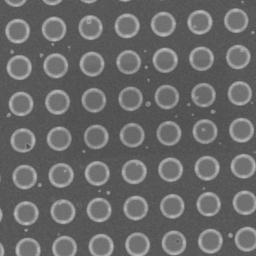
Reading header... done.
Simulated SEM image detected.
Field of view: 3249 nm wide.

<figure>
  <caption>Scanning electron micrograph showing an array of small figures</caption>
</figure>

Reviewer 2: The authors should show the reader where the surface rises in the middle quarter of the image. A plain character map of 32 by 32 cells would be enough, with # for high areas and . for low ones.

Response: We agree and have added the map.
#...######...######....#####....
#...######....####.....####.....
.....####......#................
................................
................................
........................###.....
......###......####....#####....
#....#####....#####....######...
#....#####....######...######...
#...######....######...#####....
#....#####....#####.....####....
#.....###......###..............
................................
................................
.........................##.....
.......###.....####.....#####...
#.....#####...######...######...
##...######...######...######...
##...######...######...######...
##...######...######....####....
#.....####......###.............
................................
................................
..........................#.....
.......##.......####....#####...
#.....#####....#####....######..
##...######...#######...######..
##...######....######...#####...
##...######....#####....#####...
##....#####.....###.............
#...............................
................................